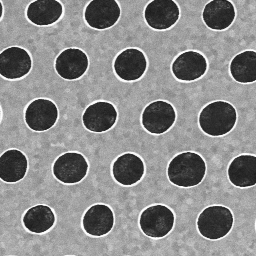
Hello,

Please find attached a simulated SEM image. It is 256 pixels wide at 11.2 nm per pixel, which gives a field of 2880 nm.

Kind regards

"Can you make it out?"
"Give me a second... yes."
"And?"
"a regular array of holes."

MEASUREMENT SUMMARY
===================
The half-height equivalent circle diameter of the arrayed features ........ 0.376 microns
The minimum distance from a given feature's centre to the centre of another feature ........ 659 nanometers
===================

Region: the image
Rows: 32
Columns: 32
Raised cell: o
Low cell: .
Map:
oooo....ooo....oooo...oooo...ooo
ooo.....ooo....ooo....ooo....ooo
oooo...oooo....ooo....ooo....ooo
oooooooooooo.oooooo..ooooo..oooo
oooooooooooooooooooooooooooooooo
oooooooooooooooooooooooooooooooo
...ooooo..ooooo...ooooo..ooooo..
....ooo....ooo....oooo....ooo...
....ooo....ooo....ooo.....ooo...
...ooooo..ooooo...oooo...oooo...
oooooooooooooooooooooooooooooooo
oooooooooooooooooooooooooooooooo
oooo..oooooooooooooooooooooooooo
ooo....oooo...oooo....ooo....ooo
ooo....ooo.....ooo....ooo.....oo
ooo....ooo....oooo....ooo....ooo
oooooooooooo.oooooo..ooooo...ooo
oooooooooooooooooooooooooooooooo
oooooooooooooooooooooooooooooooo
...oooo...ooooo..ooooo...ooooo..
...oooo....ooo....ooo.....ooo...
...oooo....ooo....ooo.....ooo...
..ooooo...oooo...oooo....oooo...
oooooooooooooooooooooooooooooooo
oooooooooooooooooooooooooooooooo
oooooooooooo.ooooooooooooooooooo
ooo....oooo...oooo....ooo....ooo
ooo....ooo....ooo.....ooo....ooo
ooo...oooo....oooo....ooo....ooo
oooooooooooo.oooooo..oooo...oooo
oooooooooooooooooooooooooooooooo
oooooooooooooooooooooooooooooooo